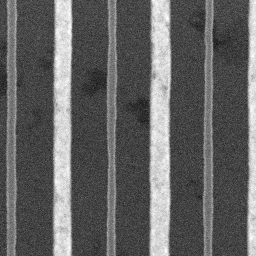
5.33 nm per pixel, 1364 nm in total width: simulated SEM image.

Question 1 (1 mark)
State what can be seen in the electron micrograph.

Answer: lines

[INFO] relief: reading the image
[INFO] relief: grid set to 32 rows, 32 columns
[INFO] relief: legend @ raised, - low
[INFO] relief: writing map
-------@@----------@@----------@
-------@@----------@@----------@
-------@@----------@@----------@
-------@@----------@@----------@
-------@@----------@@----------@
-------@@----------@@----------@
-------@@----------@@----------@
-------@@----------@@----------@
-------@@----------@@----------@
-------@@-----------@-----------
-------@@----------@-----------@
-------@@----------@-----------@
-------@@----------@@----------@
-------@-----------@@----------@
-------@@----------@@----------@
-------@@----------@@----------@
-------@@----------@@----------@
-------@@----------@@----------@
-------@@----------@@----------@
-------@@----------@@----------@
-------@@----------@@----------@
-------@@----------@@----------@
-------@@----------@@----------@
-------@@----------@@----------@
-------@@----------@@----------@
-------@@----------@@----------@
-------@@----------@@----------@
-------@@----------@@----------@
-------@@----------@@----------@
-------@@----------@@----------@
-------@@----------@@----------@
-------@@----------@@----------@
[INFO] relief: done